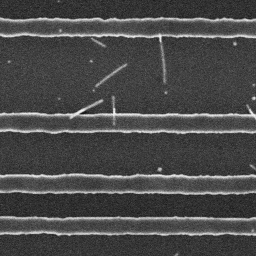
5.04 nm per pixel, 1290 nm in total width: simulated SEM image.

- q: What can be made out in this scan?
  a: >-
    lines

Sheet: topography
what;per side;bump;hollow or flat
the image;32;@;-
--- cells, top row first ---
--------------------------------
--------------------------------
@@-@@@@@@@@@@@@@@@@@@@@@@@@@@@@@
@@@@@@@@@@@@@@@@@@@@@@@@@@@@@@@@
@@---@@-@-@-@-@@@@@@@@@@@@@@@@@@
--------------------------------
--------------------------------
--------------------------------
--------------------------------
--------------------------------
--------------------------------
--------------------------------
--------------------------------
--------------------------------
@@@@@@@@@@@@@@@@@@@@@@@@@@@@@@@@
@@@@@@@@@@@@@@@@@@@@@@@@@@@@@@@@
--@@-@@@@@@@---@@@@@@@@@@@@@@@@@
--------------------------------
--------------------------------
--------------------------------
--------------------------------
--------------------------------
@@@@@@@@@@@@@@@@@@@@@@@@@@@@@@@@
@@@@@@@@@@@@@@@@@@@@@@@@@@@@@@@@
--------------------------------
--------------------------------
--------------------------------
@@@@@@@@@@@@@@@@@@@@@@@@@@@@@@@@
@@@@@@@@@@@@@@@@@@@@@@@@@@@@@@@@
--------------------------------
--------------------------------
--------------------------------